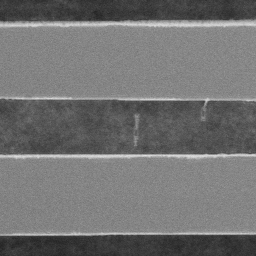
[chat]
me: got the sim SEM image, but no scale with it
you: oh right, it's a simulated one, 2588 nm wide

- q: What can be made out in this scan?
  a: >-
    lines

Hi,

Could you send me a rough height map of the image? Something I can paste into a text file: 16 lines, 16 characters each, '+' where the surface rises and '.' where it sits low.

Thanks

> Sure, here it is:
................
++++++++++++++++
++++++++++++++++
++++++++++++++++
++++++++++++++++
++++++++++++++++
................
................
................
................
++++++++++++++++
++++++++++++++++
++++++++++++++++
++++++++++++++++
++++++++++++++++
................